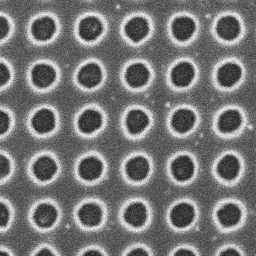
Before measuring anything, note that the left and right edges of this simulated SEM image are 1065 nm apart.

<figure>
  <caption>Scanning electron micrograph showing a regular array of holes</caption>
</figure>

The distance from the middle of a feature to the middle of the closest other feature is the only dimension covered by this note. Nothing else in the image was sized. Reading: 190 nm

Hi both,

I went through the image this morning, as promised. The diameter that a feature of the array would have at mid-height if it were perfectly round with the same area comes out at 112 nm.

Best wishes